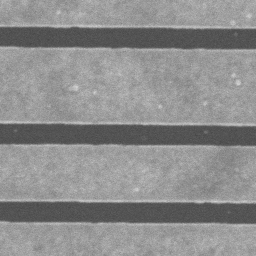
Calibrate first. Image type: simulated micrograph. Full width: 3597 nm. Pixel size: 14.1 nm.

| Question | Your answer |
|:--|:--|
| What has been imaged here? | lines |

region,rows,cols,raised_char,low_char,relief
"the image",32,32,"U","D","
UUUUUUUUUUUUUUUUUUUUUUUUUUUUUUUU
UUUUUUUUUUUUUUUUUUUUUUUUUUUUUUUU
UUUUUUUUUUUUUUUUUUUUUUUUUUUUUUUU
DDDDDDDDDDDDDDDDDDDDDDDDDDDDDDDD
DDDDDDDDDDDDDDDDDDDDDDDDDDDDDDDD
DDDDDDDDDDDDDDDDDDDDDDDDDDDDDDDD
UUUUUUUUUUUUUUUUUUUUUUUUUUUUUUUU
UUUUUUUUUUUUUUUUUUUUUUUUUUUUUUUU
UUUUUUUUUUUUUUUUUUUUUUUUUUUUUUUU
UUUUUUUUUUUUUUUUUUUUUUUUUUUUUUUU
UUUUUUUUUUUUUUUUUUUUUUUUUUUUUUUU
UUUUUUUUUUUUUUUUUUUUUUUUUUUUUUUU
UUUUUUUUUUUUUUUUUUUUUUUUUUUUUUUU
UUUUUUUUUUUUUUUUUUUUUUUUUUUUUUUU
UUUUUUUUUUUUUUUUUUUUUUUUUUUUUUUU
DDDDDDDDDDDDDDDDDDDDDUUUUUUUUUUU
DDDDDDDDDDDDDDDDDDDDDDDDDDDDDDDD
DDDDDDDDDDDDDDDDDDDDDDDDDDDDDDDD
UUUUUUUUUUUUUUUUUUUUUUUUUUUUUUUU
UUUUUUUUUUUUUUUUUUUUUUUUUUUUUUUU
UUUUUUUUUUUUUUUUUUUUUUUUUUUUUUUU
UUUUUUUUUUUUUUUUUUUUUUUUUUUUUUUU
UUUUUUUUUUUUUUUUUUUUUUUUUUUUUUUU
UUUUUUUUUUUUUUUUUUUUUUUUUUUUUUUU
UUUUUUUUUUUUUUUUUUUUUUUUUUUUUUUU
DDDDDDDDDDDDDDDDDDDDDDDDDDDDDDDD
DDDDDDDDDDDDDDDDDDDDDDDDDDDDDDDD
DDDDDDDDDDDDDDDDDDDDDDDDDDDDDDDD
UUUUUUUUUUUUUUUUUUUUUUUUUUUUUUUU
UUUUUUUUUUUUUUUUUUUUUUUUUUUUUUUU
UUUUUUUUUUUUUUUUUUUUUUUUUUUUUUUU
UUUUUUUUUUUUUUUUUUUUUUUUUUUUUUUU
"